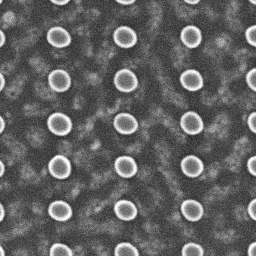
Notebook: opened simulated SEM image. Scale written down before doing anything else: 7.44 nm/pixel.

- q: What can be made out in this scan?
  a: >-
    a regular array of raised bodies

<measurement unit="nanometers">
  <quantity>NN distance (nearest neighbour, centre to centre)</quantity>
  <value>322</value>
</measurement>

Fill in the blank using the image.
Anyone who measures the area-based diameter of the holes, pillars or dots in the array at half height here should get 155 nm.